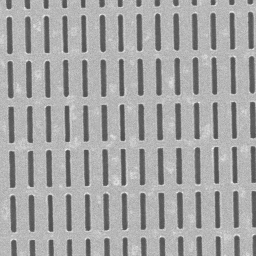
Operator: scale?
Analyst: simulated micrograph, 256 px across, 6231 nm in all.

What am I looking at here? a regular array of holes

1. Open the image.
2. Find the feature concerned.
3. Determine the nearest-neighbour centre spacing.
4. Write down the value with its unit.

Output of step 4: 447 nm